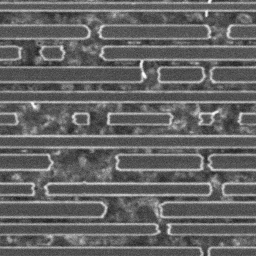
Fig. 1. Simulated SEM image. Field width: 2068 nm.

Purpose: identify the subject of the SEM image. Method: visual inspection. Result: parallel lines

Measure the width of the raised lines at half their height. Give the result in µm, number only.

0.0979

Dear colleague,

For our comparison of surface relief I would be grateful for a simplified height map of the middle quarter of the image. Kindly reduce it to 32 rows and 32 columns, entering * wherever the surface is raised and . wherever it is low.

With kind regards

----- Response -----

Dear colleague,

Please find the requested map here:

................................
********************....********
********************....********
********************....********
................................
................................
................................
********************************
********************************
................................
................................
................................
...***.....***************......
...***.....****************.....
...***.....****************.....
................................
................................
................................
********************************
********************************
********************************
................................
................................
.............*******************
..............******************
.............*******************
................................
................................
................................
................................
********************************
********************************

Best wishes